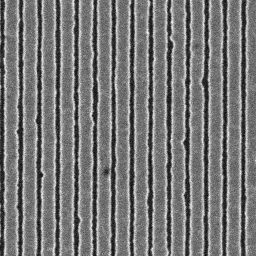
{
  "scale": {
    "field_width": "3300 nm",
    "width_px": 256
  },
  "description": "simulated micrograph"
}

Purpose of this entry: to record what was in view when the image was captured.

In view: parallel lines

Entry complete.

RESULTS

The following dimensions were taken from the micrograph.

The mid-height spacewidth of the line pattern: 66.1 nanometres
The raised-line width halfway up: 172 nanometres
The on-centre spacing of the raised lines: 239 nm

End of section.